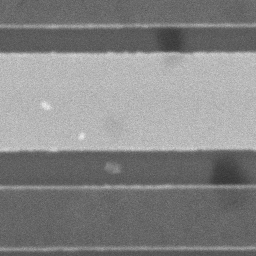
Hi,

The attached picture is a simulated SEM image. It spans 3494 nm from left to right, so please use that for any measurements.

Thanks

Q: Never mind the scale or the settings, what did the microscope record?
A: lines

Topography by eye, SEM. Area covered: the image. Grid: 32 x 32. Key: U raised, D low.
UUUUUUUUUUUUUUUUUUUUUUUUUUUUUUUU
UUUUUUUUUUUUUUUUUUUUUUUUUUUUUUUU
UUUUUUUUUUUUUUUUUUUUUUUUUUUUUUUU
DDDDDDDDDDDDDDDDDDDDDDDDDDDDDDDD
DDDDDDDDDDDDDDDDDDDDDDDDDDDDDDDD
DDDDDDDDDDDDDDDDDDDDDDDDDDDDDDDD
DDDDDDDDDDDDDDDDDDDDDDDDDDDDDDDD
UUUUUUUUUUUUUUUUUUUUUUUUUUUUUUUU
UUUUUUUUUUUUUUUUUUUUUUUUUUUUUUUU
UUUUUUUUUUUUUUUUUUUUUUUUUUUUUUUU
UUUUUUUUUUUUUUUUUUUUUUUUUUUUUUUU
UUUUUUUUUUUUUUUUUUUUUUUUUUUUUUUU
UUUUUUUUUUUUUUUUUUUUUUUUUUUUUUUU
UUUUUUUUUUUUUUUUUUUUUUUUUUUUUUUU
UUUUUUUUUUUUUUUUUUUUUUUUUUUUUUUU
UUUUUUUUUUUUUUUUUUUUUUUUUUUUUUUU
UUUUUUUUUUUUUUUUUUUUUUUUUUUUUUUU
UUUUUUUUUUUUUUUUUUUUUUUUUUUUUUUU
UUUUUUUUUUUUUUUUUUUUUUUUUUUUUUUU
DDDDDDDDDDDDDDDDDDDDDDDDDDDDDDDD
DDDDDDDDDDDDDDDDDDDDDDDDDDDDDDDD
DDDDDDDDDDDDDDDDDDDDDDDDDDDDDDDD
DDDDDDDDDDDDDDDDDDDDDDDDDDDDDDDD
UUUUUUUUUUUUUUUUUUUUUUUUUUUUUUUU
UUUUUUUUUUUUUUUUUUUUUUUUUUUUUUUU
UUUUUUUUUUUUUUUUUUUUUUUUUUUUUUUU
UUUUUUUUUUUUUUUUUUUUUUUUUUUUUUUU
UUUUUUUUUUUUUUUUUUUUUUUUUUUUUUUU
UUUUUUUUUUUUUUUUUUUUUUUUUUUUUUUU
UUUUUUUUUUUUUUUUUUUUUUUUUUUUUUUU
UUUUUUUUUUUUUUUUUUUUUUUUUUUUUUUU
DDDDDDDDDDDDDDDDDDDDDDDDDDDDDDDD